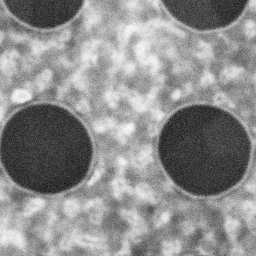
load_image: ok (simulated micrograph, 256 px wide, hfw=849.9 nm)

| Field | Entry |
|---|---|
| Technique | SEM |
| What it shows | raised bodies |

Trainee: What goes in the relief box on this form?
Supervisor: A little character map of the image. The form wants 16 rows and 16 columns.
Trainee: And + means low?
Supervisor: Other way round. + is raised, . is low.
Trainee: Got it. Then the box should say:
+++++.....+++++.
.+++.......++++.
................
................
................
................
.+++........+...
+++++.....+++++.
++++++....++++++
++++++....++++++
++++++....++++++
.++++......++++.
................
................
................
................